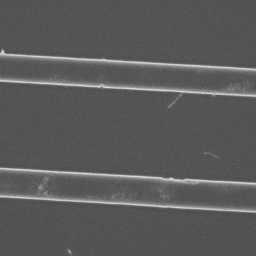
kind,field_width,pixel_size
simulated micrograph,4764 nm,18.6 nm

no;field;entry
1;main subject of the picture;one or a few lines or trenches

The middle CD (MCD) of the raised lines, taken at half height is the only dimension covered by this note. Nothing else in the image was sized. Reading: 0.52 microns